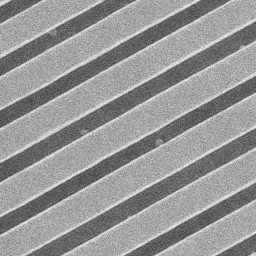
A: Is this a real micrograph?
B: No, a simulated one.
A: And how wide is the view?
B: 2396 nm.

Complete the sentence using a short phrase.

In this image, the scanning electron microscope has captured lines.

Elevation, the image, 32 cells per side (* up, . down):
....********....********....****
...*******....********....******
.********....********....*******
*******....********....*******..
*****....********....********...
***....********....********....*
*....********....********....***
....********...********.....****
..********....*******.....******
********....********....********
******....********....********..
****....********....********....
**....********....********....**
*....*******.....********....***
...********....********....*****
.********....********....*******
*******....********....********.
*****.....********...********...
***.....********....*******.....
**....********....********....**
....********....********....****
..********....********....******
.*******....********.....*******
*******....*******.....********.
*****....********....********...
***....********....********....*
*....********....********....***
...********.....*******....*****
..*******.....********....******
********....********....*******.
******....********....********..
****.....*******....********....